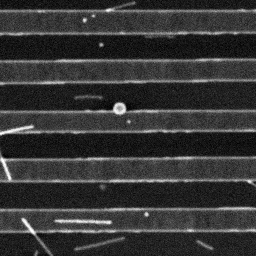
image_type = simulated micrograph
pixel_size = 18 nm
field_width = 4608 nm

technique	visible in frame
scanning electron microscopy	lines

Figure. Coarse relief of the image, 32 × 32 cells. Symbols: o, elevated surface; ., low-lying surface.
................................
oooooooooooooooooooooooooooooooo
oooooooooooooooooooooooooooooooo
oooooooooooooooooooooooooooooooo
................................
................................
................................
........................oooooooo
oooooooooooooooooooooooooooooooo
oooooooooooooooooooooooooooooooo
o...............................
................................
................................
..............oo................
oooooooooooooooooooooooooooooooo
oooooooooooooooooooooooooooooooo
ooooo.oo.oo.....................
................................
................................
................................
oooooooooooooooooooooooooooooooo
oooooooooooooooooooooooooooooooo
oooooooooooooooooooooooooooooooo
................................
................................
................................
oooooooooooooooooooooooooooooooo
oooooooooooooooooooooooooooooooo
oooooooooooooooooooooooooooooooo
................................
................................
................................